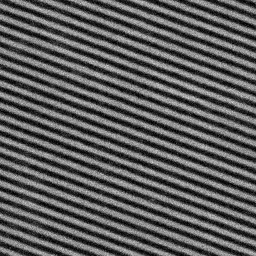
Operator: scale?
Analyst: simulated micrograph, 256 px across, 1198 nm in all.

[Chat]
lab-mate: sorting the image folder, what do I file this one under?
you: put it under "parallel lines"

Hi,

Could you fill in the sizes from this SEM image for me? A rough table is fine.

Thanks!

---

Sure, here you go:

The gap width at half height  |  29.1 nm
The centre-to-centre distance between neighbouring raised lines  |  48.6 nm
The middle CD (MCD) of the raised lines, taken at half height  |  20.9 nanometres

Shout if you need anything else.